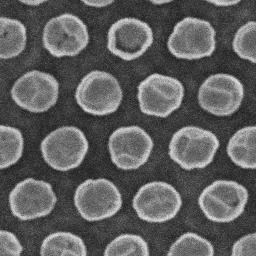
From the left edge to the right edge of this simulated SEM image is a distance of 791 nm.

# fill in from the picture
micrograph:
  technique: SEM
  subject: a regular array of raised bodies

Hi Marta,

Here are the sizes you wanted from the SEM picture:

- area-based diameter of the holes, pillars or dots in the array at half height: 41.8 px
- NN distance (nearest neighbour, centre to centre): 186 nanometers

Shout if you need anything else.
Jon